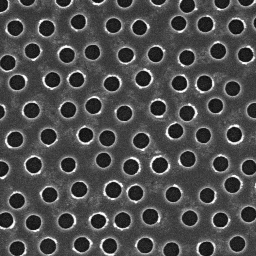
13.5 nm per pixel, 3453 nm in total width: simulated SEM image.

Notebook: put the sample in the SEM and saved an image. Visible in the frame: a regular array of holes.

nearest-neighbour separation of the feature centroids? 0.367 µm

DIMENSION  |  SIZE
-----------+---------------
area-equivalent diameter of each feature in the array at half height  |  216 nm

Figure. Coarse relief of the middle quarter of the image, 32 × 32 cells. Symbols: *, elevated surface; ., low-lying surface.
********************************
********************************
**...*************....**********
*....******..*****....*****...**
*....*****....****....*****....*
**..******....*****..******....*
***********..***************..**
********************************
*******.************************
..****...*************...*******
...**.....****..******...*****..
...***...****....*****...****...
...**********....*****...****...
*.***********....************...
********************************
***************************..***
****...***.***************....**
****...**....*****..******....**
****...**....****....******..***
****..***....****....***********
**********..******...***********
********************************
*********..******************...
..******....***********..****...
...*****....***...****....***...
...******..****....***....****..
..*************....***....******
****************..**************
********************************
***.********.*******************
**....*****...***..*************
**....****....**....******...***